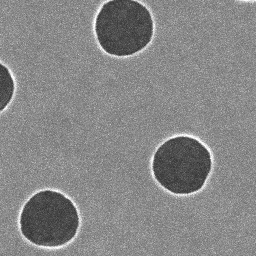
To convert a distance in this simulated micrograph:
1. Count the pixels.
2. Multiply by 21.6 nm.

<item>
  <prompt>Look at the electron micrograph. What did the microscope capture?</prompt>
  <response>holes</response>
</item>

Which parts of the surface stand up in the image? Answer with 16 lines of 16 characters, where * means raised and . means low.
******...*******
******....******
******...*******
****************
.***************
.***************
****************
****************
****************
**********...***
**********...***
**********...***
**..************
*....***********
*....***********
****************